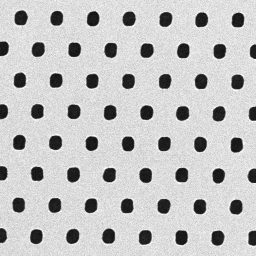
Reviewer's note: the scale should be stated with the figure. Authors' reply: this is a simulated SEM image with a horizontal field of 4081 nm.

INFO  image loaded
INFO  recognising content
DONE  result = a regular array of holes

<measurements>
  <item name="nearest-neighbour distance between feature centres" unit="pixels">35.7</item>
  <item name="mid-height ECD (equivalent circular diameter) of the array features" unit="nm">230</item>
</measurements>